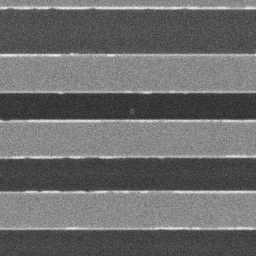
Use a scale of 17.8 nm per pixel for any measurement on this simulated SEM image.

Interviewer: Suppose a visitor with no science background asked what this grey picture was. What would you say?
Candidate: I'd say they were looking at lines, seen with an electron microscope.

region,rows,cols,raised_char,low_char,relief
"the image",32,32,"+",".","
++++++++++++++++++++++++++++++++
................................
................................
................................
................................
................................
................................
++++++++++++++++++++++++++++++++
++++++++++++++++++++++++++++++++
++++++++++++++++++++++++++++++++
++++++++++++++++++++++++++++++++
++++++++++++++++++++++++++++++++
................................
................................
................................
++++++++++++++++++++++++++++++++
++++++++++++++++++++++++++++++++
++++++++++++++++++++++++++++++++
++++++++++++++++++++++++++++++++
++++++++++++++++++++++++++++++++
................................
................................
................................
................................
++++++++++++++++++++++++++++++++
++++++++++++++++++++++++++++++++
++++++++++++++++++++++++++++++++
++++++++++++++++++++++++++++++++
++++++++++++++++++++++++++++++++
................................
................................
................................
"